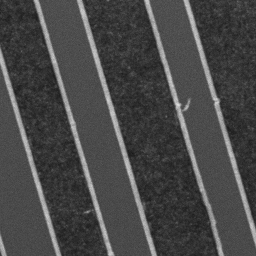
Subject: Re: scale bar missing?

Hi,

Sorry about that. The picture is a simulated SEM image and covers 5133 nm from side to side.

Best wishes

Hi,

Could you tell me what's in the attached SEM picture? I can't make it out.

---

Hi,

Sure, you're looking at one or a few lines or trenches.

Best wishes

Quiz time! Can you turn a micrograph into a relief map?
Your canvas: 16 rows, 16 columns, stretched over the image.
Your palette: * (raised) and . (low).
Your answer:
**...****...****
***..*****..****
***...****..****
***...****...***
****..****...***
.***...****..***
.***...****...**
.***...****...**
..***..*****..**
..***...****..**
..***...****...*
..****..*****..*
...***...****..*
...***...****...
...***...****...
....***...****..